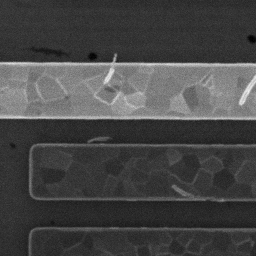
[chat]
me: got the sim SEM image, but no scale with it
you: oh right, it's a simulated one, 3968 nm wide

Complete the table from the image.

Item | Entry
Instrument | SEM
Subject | wiring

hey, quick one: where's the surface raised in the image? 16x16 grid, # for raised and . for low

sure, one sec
................
................
................
................
################
################
################
................
................
..##############
..##############
..##############
.............###
................
..##############
..##############